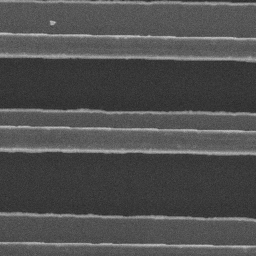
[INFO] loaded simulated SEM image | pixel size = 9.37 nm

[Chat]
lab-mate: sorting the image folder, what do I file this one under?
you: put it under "lines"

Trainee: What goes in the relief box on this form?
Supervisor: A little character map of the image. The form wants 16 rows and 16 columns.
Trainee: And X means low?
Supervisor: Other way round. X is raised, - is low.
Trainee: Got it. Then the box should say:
XXXXXXXXXXXXXXXX
XXXXXXXXXXXXXXXX
XXXXXXXXXXXXXXXX
-XXXXXXXXXXXXXXX
----------------
----------------
----------------
XXXXXXXXXXXXXXXX
XXXXXXXXXXXXXXXX
-------X-XXXXXXX
----------------
----------------
----------------
XXXXX-----------
XXXXXXXXXXXXXXXX
XXXXXXXXXXXXXXXX